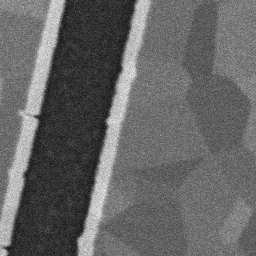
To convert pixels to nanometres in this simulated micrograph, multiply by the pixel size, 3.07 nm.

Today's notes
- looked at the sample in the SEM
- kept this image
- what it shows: one or a few lines or trenches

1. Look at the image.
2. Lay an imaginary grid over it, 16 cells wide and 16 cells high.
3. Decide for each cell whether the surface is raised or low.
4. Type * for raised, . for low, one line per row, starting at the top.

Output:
***......*******
***......*******
***.....********
***.....********
***.....********
**......********
**......********
**.....*********
**.....*********
*......*********
*......*********
*.....**********
*.....**********
......**********
......**********
.....***********